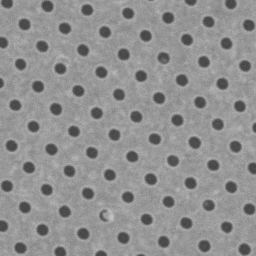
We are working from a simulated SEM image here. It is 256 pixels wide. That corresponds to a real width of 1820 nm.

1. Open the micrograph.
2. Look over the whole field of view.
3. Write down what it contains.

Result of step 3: a regular array of holes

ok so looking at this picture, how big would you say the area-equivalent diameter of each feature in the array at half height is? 93.3 nm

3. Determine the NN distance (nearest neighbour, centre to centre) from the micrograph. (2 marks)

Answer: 201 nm